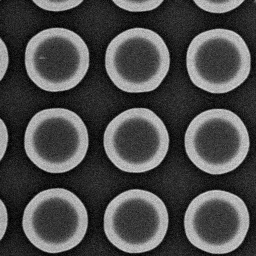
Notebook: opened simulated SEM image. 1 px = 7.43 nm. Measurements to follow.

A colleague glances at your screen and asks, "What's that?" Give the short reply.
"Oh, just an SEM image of an array of small figures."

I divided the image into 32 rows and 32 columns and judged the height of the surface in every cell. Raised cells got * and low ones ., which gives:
.....*****.....*****.....*****..
..........................**....
................................
................................
....******.....*****.....*****..
*..********...*******...*******.
*..********..********..********.
*..********..********..********.
*..********..********..********.
....******....*******...*******.
....******....******....******..
................**........**....
................................
................................
....******.....*****.....*****..
*...*******...******....******..
*..********..********..********.
*..********..********..********.
*..********..********..********.
....*******..********...*******.
....******....******....******..
......**........**........***...
................................
................................
....*****......*****.....*****..
....******....******....*******.
*..********..********..********.
*..********..********..********.
*..********..********..********.
...********..********..********.
....******....******....******..
......**........**........***...